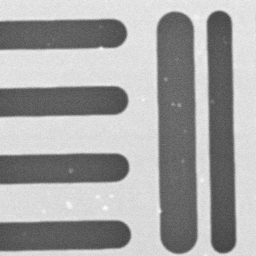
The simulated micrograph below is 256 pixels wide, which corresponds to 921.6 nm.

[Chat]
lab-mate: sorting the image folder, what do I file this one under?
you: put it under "groups of lines, slits or small figures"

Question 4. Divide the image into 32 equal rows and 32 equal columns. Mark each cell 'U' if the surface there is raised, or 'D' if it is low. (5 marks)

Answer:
UUUUUUUUUUUUUUUUUUUUUUUUUUUUUUUU
UUUUUUUUUUUUUUUUUUUUUDUUUUUDUUUU
UDDDDDDDDDDDDDDUUUUUDDDDUUDDDUUU
DDDDDDDDDDDDDDDDUUUUDDDDUUDDDUUU
DDDDDDDDDDDDDDDDUUUUDDDDUUDDDUUU
DDDDDDDDDDDDDDDUUUUUDDDDUUDDDUUU
UUUUUUUUUUUUUUUUUUUUDDDDUUDDDUUU
UUUUUUUUUUUUUUUUUUUUDDDDUUDDDUUU
UUUUUUUUUUUUUUUUUUUUDDDDUUDDDUUU
UUUUUUUUUUUUUUUUUUUUDDDDUUDDDUUU
UUUUUUUUUUUUUUUUUUUUDDDDUUDDDUUU
DDDDDDDDDDDDDDDDUUUUDDDDUUDDDUUU
DDDDDDDDDDDDDDDDUUUUDDDDUUDDDUUU
DDDDDDDDDDDDDDDDUUUUDDDDUUDDDUUU
DDDDDDDDDDUUUUUUUUUUDDDDUUDDDUUU
UUUUUUUUUUUUUUUUUUUUDDDDDUDDDUUU
UUUUUUUUUUUUUUUUUUUUDDDDDUDDDUUU
UUUUUUUUUUUUUUUUUUUUDDDDDUDDDUUU
UUUUUUUUUUUUUUUUUUUUDDDDDUDDDUUU
DDDDDDDDDDDDDDDUUUUUDDDDDUDDDUUU
DDDDDDDDDDDDDDDDUUUUDDDDDUDDDUUU
DDDDDDDDDDDDDDDDUUUUDDDDDUDDDUUU
DDDDDDDDDDDDDDDUUUUUDDDDDUDDDUUU
UUUUUUUUUUUUUUUUUUUUDDDDDUDDDUUU
UUUUUUUUUUUUUUUUUUUUDDDDDUDDDUUU
UUUUUUUUUUUUUUUUUUUUDDDDDUDDDUUU
UUUUUUUUUUUUUUUUUUUUDDDDDUDDDUUU
UUUUUUUUUUUDDDDUUUUUDDDDDUDDDUUU
DDDDDDDDDDDDDDDDUUUUDDDDDUDDDDUU
DDDDDDDDDDDDDDDDUUUUDDDDDUDDDDUU
DDDDDDDDDDDDDDDDUUUUDDDDUUDDDUUU
DDUUUUUUUUUUUUUUUUUUUDDDUUUDDUUU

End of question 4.